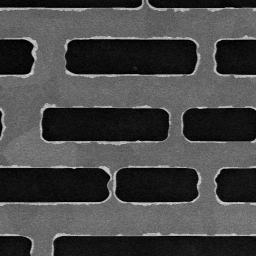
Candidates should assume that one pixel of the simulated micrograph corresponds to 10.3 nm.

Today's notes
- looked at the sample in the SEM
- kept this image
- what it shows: one or a few lines or trenches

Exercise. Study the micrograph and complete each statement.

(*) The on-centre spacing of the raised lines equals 667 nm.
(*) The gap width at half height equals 351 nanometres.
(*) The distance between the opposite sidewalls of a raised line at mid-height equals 341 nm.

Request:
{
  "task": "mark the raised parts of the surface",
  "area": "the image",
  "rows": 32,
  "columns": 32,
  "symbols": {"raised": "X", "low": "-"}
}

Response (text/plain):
------------------X-------------
XXXXXXXXXXXXXXXXXXXXXXXXXXXXXXXX
XXXXXXXXXXXXXXXXXXXXXXXXXXXXXXXX
XXXXXXXXXXXXXXXXXXXXXXXXXXXXXXXX
XXXXXXXXXXXXXXXXXXXXXXXXXXXXXXXX
----XXXX----------------XXX-----
----XXXX-----------------XX-----
----XXXX-----------------XX-----
----XXXX----------------XXX-----
XXXXXXXXXXXXXXXXXXXXXXXXXXXXXXXX
XXXXXXXXXXXXXXXXXXXXXXXXXXXXXXXX
XXXXXXXXXXXXXXXXXXXXXXXXXXXXXXXX
XXXXXXXXXXXXXXXXXXXXXXXXXXXXXXXX
XXXXXX--------------XXXXXX-----X
XXXXX----------------XX---------
XXXXX----------------XX---------
XXXXX----------------XX---------
XXXXXX---------------XXX--------
XXXXXXXXXXXXXXXXXXXXXXXXXXXXXXXX
XXXXXXXXXXXXXXXXXXXXXXXXXXXXXXXX
XXXXXXXXXXXXXXXXXXXXXXXXXXXXXXXX
-------------XX----------XX-----
-------------------------XX-----
-------------------------XX-----
--------------X----------XX-----
XXXXXXXXXXXXXXXXXXXXXXXXXXXXXXXX
XXXXXXXXXXXXXXXXXXXXXXXXXXXXXXXX
XXXXXXXXXXXXXXXXXXXXXXXXXXXXXXXX
XXXXXXXXXXXXXXXXXXXXXXXXXXXXXXXX
---XXXXX------------------------
----XXX-------------------------
----XXX-------------------------